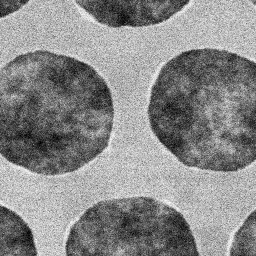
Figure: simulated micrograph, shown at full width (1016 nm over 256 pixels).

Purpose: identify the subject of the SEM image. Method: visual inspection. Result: holes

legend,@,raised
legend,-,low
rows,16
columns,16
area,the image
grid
-@@@@-------@@@@
@@@@@@----@@@@@@
@@@@@@@@@@@@@@@@
@---@@@@@@@----@
------@@@@------
-------@@-------
-------@@-------
-------@@-------
-------@@@------
------@@@@@-----
@----@@@@@@@---@
@@@@@@@@@@@@@@@@
@@@@@@@---@@@@@@
-@@@@------@@@@@
--@@--------@@@-
--@@--------@@--